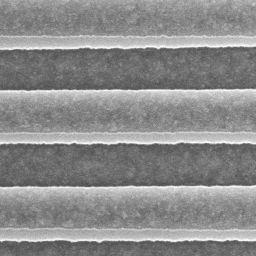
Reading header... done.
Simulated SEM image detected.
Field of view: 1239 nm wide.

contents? lines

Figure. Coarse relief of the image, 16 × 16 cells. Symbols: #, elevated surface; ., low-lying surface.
################
################
################
................
................
................
################
################
################
................
................
................
################
################
################
................